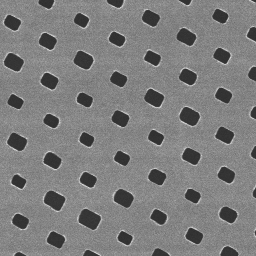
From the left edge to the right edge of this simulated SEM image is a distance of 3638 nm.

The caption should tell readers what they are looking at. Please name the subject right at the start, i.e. a regular array of holes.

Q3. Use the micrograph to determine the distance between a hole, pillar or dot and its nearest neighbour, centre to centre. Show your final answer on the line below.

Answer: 563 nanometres